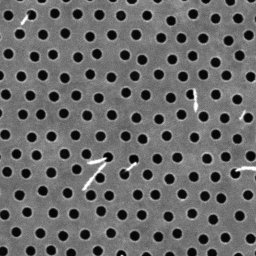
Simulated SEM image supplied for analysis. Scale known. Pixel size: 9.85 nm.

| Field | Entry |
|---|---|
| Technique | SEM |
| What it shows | a regular array of holes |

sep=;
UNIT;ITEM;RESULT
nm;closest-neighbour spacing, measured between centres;196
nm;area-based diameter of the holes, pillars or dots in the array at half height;101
